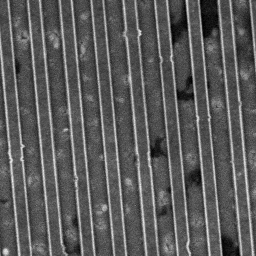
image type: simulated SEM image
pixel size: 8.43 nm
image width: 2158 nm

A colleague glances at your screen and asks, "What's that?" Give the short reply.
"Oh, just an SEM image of parallel lines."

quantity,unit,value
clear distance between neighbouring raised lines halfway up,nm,165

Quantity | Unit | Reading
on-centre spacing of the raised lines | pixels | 31.6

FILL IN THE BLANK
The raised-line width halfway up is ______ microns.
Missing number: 0.0987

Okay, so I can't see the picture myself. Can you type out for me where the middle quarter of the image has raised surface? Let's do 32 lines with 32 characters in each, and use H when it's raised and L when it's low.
HHHLLLLLLHHLLLLLHHHLLLLLHHHLLLLL
LHHLLLLLLHHLLLLLHHHLLLLLHHHLLLLL
LHHLLLLLLHHLLLLLLHHLLLLLHHHLLLLL
LHHLLLLLLHHHLLLLLHHLLLLLLHHLLLLL
LHHHLLLLLHHHLLLLLHHHLLLLLHHLLLLL
LHHHLLLLLHHHLLLLLHHHLLLLLHHLLLLL
LHHHLLLLLHHHLLLLLHHHLLLLLHHHLLLL
LHHHLLLLLHHHLLLLLHHHLLLLLHHHLLLL
LHHHLLLLLHHHLLLLLHHHLLLLLHHHLLLL
LHHHLLLLLHHHLLLLLHHHLLLLLHHHLLLL
LHHHLLLLLHHHLLLLLHHHLLLLLHHHLLLL
LHHHLLLLLHHHLLLLLHHHLLLLLHHHLLLL
LLHHLLLLLHHHLLLLLHHHLLLLLHHHLLLL
LLHHLLLLLHHHLLLLLLHHLLLLLHHHLLLL
LLHHLLLLLLHHHLLLLLHHLLLLLHHHHLLL
LLHHHLLLLLHHHLLLLLHHHLLLLLHHHLLL
LLHHHLLLLLHHHLLLLLHHHLLLLLHHHLLL
LLHHHLLLLLHHHLLLLLHHHLLLLLHHHLLL
LLHHHLLLLLHHHLLLLLHHHLLLLLHHHLLL
LLHHHLLLLLHHHLLLLLHHHLLLLLHHHLLL
LLHHHLLLLLHHHLLLLLHHHLLLLLHHHLLL
LLHHHLLLLLHHHLLLLLHHHLLLLLHHHLLL
LLHHHLLLLLHHHLLLLLHHHLLLLLHHHLLL
LLLHHLLLLLHHHLLLLLLHHLLLLLHHHLLL
LLLHHLLLLLHHHLLLLLLHHLLLLLHHHLLL
LLLHHLLLLLLHHHLLLLLHHLLLLLHHHLLL
LLLHHHLLLLLHHHLLLLLHHLLLLLLHHHLL
LLLHHHLLLLLHHHLLLLLHHHLLLLLHHHLL
LLLHHHLLLLLHHHLLLLLHHHLLLLLHHHLL
LLLHHHLLLLLHHHLLLLLHHHLLLLLHHHLL
LLLHHHLLLLLHHHLLLLLHHHLLLLLHHHLL
LLLHHHLLLLLHHHLLLLLHHHLLLLLHHHLL